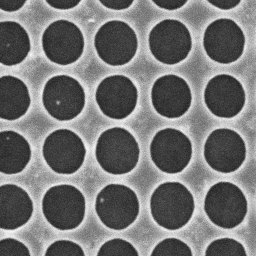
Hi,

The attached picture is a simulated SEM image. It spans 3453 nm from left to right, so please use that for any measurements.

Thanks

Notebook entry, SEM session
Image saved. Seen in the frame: a regular array of holes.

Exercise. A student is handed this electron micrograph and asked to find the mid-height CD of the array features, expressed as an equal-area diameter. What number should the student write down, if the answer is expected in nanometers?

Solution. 603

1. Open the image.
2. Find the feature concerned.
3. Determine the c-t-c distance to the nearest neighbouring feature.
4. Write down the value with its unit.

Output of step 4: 0.72 um